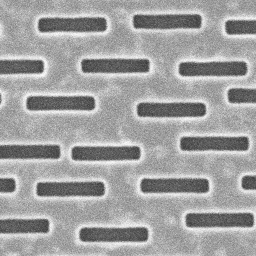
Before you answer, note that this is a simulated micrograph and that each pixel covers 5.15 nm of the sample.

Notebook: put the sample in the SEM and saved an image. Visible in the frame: a regular array of holes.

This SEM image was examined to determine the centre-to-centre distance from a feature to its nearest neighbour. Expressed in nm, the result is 298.